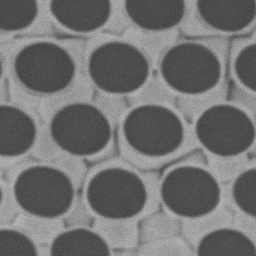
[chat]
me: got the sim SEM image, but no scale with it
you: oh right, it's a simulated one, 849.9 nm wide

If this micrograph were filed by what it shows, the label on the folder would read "a regular array of holes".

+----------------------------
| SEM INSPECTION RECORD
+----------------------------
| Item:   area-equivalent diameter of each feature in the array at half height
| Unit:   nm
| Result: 181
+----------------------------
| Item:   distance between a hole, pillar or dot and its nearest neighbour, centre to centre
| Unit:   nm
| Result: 238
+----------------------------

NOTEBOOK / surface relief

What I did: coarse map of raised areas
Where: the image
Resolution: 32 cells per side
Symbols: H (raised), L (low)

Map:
LLLLLHLLLLLLLLHHLLLLLLLHHLLLLLLL
LLLLLHHLLLLLLLHHLLLLLLLHHLLLLLLL
LLLLHHHLLLLLLHHHHLLLLLLHHHLLLLLL
LLLHHHHHHLLLHHHHHHLLLHHHHHHLLLHH
HHHHHHHHHHHHHHHHHHHHHHHHHHHHHHHH
HHHHLLLHHHHHHLLLHHHHHHHLLHHHHHHH
HHHLLLLLHHHHLLLLLHHHHLLLLLHHHHLL
HHLLLLLLLHHLLLLLLLHHLLLLLLLHHHLL
HHLLLLLLLHHLLLLLLLLHLLLLLLLHHLLL
HHLLLLLLLHHLLLLLLLHHLLLLLLLHHHLL
HHHLLLLLLHHHLLLLLLHHHLLLLLLHHHHL
HHHHHLLHHHHHHLLLHHHHHHHLLHHHHHHH
HHHHHHHHHHHHHHHHHHHHHHHHHHHHHHHH
LLHHHHHHLLLLHHHHHLLLLHHHHHLLLLHH
LLLHHHHLLLLLLHHHLLLLLLHHHLLLLLLH
LLLLHHLLLLLLLLHHLLLLLLLHHLLLLLLL
LLLLHHLLLLLLLLHHLLLLLLLHHLLLLLLL
LLLLHHHLLLLLLLHHLLLLLLLHHLLLLLLL
LLLLHHHHLLLLLHHHHLLLLLHHHHLLLLLH
HHHHHHHHHHHHHHHHHHHLHHHHHHHHLHHH
HHHHHHHHHHHHHHHHHHHHHHHHHHHHHHHH
HHHLLLLLHHHHHLLLHHHHHLLLLLHHHHHL
HHLLLLLLLHHLLLLLLLHHHLLLLLLHHHLL
HHLLLLLLLHHLLLLLLLHHLLLLLLLHHLLL
HHLLLLLLLHHLLLLLLLHHLLLLLLLHHLLL
HHLLLLLLLHHLLLLLLLHHHLLLLLLHHHLL
HHHHLLLLHHHHLLLLLHHHHHLLLLHHHHHL
HHHHHHHHHHHHHHHHHHHHHHHHHHHHHHHH
HHHHHHHHHHHHHHHHHHHHHHHHHHHHHHHH
LLLHHHHLLLLLHHHHHHHHHHHHHHLLLLLH
LLLLHHHLLLLLLHHHHHHHHHHHHLLLLLLL
LLLLHHLLLLLLLLHHHHHHHHHHHLLLLLLL